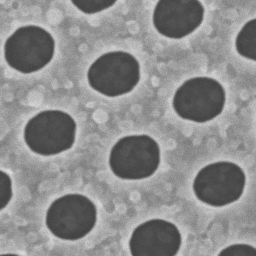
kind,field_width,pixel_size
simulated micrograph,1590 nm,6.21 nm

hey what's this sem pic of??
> holes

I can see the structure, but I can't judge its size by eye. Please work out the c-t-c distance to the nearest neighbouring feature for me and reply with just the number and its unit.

86.1 pixels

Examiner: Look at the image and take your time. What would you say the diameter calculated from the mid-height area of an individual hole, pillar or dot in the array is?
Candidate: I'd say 0.304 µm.